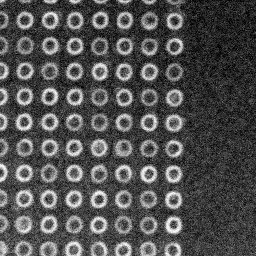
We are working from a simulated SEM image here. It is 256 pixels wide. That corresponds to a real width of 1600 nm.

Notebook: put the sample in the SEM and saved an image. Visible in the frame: a regular array of raised bodies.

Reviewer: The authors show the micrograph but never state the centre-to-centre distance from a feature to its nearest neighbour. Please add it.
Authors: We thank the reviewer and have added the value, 155 nanometres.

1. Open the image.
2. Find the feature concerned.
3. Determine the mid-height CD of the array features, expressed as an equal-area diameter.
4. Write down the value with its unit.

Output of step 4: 15.4 px